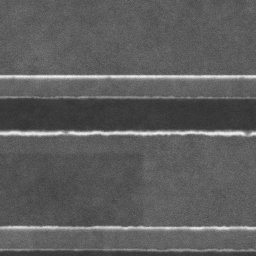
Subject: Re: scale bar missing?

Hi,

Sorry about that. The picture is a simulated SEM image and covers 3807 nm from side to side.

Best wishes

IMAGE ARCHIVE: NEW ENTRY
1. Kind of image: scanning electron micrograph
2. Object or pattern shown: lines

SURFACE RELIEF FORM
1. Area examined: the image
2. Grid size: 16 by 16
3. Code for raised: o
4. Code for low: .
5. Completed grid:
................
................
................
................
................
oooooooooooooooo
oooooooooooooooo
oooooooooooooooo
................
................
................
................
................
................
oooooooooooooooo
oooooooooooooooo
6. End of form